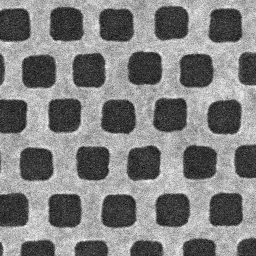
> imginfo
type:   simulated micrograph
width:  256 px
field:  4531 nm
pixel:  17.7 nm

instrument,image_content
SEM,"a regular array of holes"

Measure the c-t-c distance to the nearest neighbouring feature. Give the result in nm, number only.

914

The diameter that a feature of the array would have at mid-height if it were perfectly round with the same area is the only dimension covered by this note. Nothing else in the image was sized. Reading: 0.656 microns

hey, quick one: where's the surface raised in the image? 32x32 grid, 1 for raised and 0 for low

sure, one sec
11111111111111111111111111111111
00011100001110001111000111000011
00001100001100000110000011000011
00001100001100000110000111000011
00001100001110000111000111000011
11111111111111111111111111111111
11111111111111111001111111111110
01100001100001110000111000111100
01100001100001110000110000011100
01100001100001110000110000011100
11100001100001111000111000111100
11111111111111111111111111111111
00111110001110001111000111111111
00001100001110000110000111000011
00011100001110000110000111000011
00011100001100000110000111000011
00011110011110001111111111100011
11111111111111111111111111111111
11110111110001111000111000111100
11000001110000110000111000011000
11000001110000110000111000011000
11000001110000110000111000011000
11100011110001110011111111111111
11111111111111111111111111111111
00011100001110001111000111100011
00001100001110000110000011000011
00001100001110000110000011000011
00001100001110000111000011000011
10111110011111111111111111111111
11111111111111111111111111111111
11100001110001111000111000011100
11100001100000110000111000011000